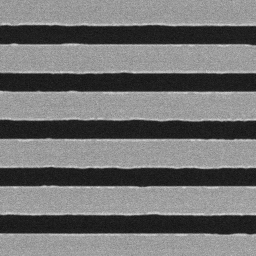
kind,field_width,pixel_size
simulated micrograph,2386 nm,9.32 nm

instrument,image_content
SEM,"lines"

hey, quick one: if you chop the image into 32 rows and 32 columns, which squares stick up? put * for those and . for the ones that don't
********************************
********************************
********************************
................................
................................
................................
********************************
********************************
********************************
................................
................................
**..*...**......................
********************************
********************************
********************************
................................
................................
********************************
********************************
********************************
********************************
................................
................................
********************************
********************************
********************************
********************************
................................
................................
********************************
********************************
********************************